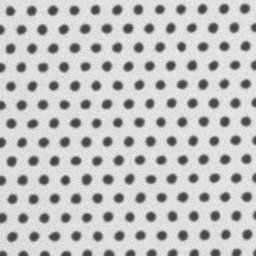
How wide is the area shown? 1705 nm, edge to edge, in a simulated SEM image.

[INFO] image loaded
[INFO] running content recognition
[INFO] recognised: a regular array of holes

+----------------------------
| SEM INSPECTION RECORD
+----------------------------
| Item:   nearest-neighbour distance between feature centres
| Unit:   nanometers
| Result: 141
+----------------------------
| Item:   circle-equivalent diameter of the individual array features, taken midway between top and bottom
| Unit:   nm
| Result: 62.5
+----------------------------